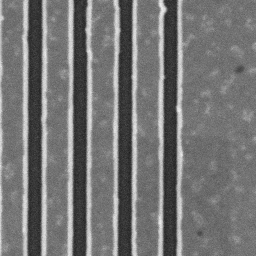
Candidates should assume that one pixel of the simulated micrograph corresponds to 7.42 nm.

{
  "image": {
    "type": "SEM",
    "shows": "parallel lines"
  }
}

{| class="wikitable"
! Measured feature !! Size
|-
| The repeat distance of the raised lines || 335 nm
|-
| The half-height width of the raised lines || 209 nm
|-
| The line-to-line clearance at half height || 0.126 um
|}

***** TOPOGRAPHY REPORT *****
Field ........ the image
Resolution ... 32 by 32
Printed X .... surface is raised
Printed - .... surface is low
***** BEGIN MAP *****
XXX---XXX--XXXX--XXX--XXXXXXXXXX
XXX---XXX--XXXX--XXX--XXXXXXXXXX
XXX---XXX--XXXX--XXX--XXXXXXXXXX
XXX---XXX--XXXX--XXX--XXXXXXXXXX
XXX---XXX--XXXX--XXX--XXXXXXXXXX
XXX---XXX--XXXX--XXX--XXXXXXXXXX
XXX---XXX--XXXX--XXX--XXXXXXXXXX
XXX---XXX--XXXX--XXX--XXXXXXXXXX
XXX---XXX--XXXX--XXX--XXXXXXXXXX
XXX--XXXX--XXXX--XXX--XXXXXXXXXX
XXX--XXXX--XXXX--XXX--XXXXXXXXXX
XXX--XXXX--XXXX--XXX--XXXXXXXXXX
XXX--XXXX--XXXX--XXX--XXXXXXXXXX
XXX---XXX--XXX---XXX--XXXXXXXXXX
XXX--XXXX--XXXX--XXX--XXXXXXXXXX
XXX--XXXX--XXXX--XXX--XXXXXXXXXX
XXX---XXX--XXXX--XXX--XXXXXXXXXX
XXX--XXXX--XXXX--XXX--XXXXXXXXXX
XXX--XXXX--XXXX--XXX--XXXXXXXXXX
XXX---XXX--XXXX--XXX--XXXXXXXXXX
XXX---XXX--XXXX--XXX--XXXXXXXXXX
XXX---XXX--XXXX--XXX--XXXXXXXXXX
XXX---XXX--XXXX--XXX--XXXXXXXXXX
XXX---XXX--XXX---XXX--XXXXXXXXXX
XXX---XXX--XXX---XXX--XXXXXXXXXX
XXX---XXX--XXX---XXX--XXXXXXXXXX
XXX---XXX--XXX---XXX--XXXXXXXXXX
XXX--XXXX--XXX---XXX--XXXXXXXXXX
XXX--XXXX--XXX---XXX--XXXXXXXXXX
XXX--XXXX--XXX---XXX--XXXXXXXXXX
XXX--XXXX--XXX---XXX--XXXXXXXXXX
XXX--XXXX--XXX---XXX--XXXXXXXXXX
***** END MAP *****